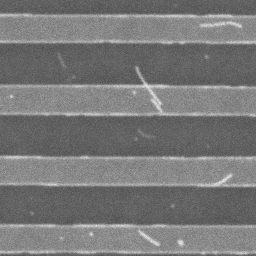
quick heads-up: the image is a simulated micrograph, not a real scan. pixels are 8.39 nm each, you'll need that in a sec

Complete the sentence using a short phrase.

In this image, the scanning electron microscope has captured lines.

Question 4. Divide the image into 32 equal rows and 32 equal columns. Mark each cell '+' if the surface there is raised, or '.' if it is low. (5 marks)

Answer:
................................
................................
++++++++++++++++++++++++++++++++
++++++++++++++++++++++++++++++++
++++++++++++++++++++++++++++++++
................................
................................
................................
................................
................................
................................
++++++++++++++++++++++++++++++++
++++++++++++++++++++++++++++++++
++++++++++++++++++++++++++++++++
................................
................................
................................
................................
................................
................................
++++++++++++++++++++++++++++++++
++++++++++++++++++++++++++++++++
++++++++++++++++++++++++++++++++
................................
................................
................................
................................
................................
++++++++++++++++++++++++++++++++
++++++++++++++++++++++++++++++++
++++++++++++++++++++++++++++++++
+++++++..+++..++++++++++++++++++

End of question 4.